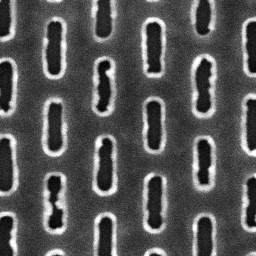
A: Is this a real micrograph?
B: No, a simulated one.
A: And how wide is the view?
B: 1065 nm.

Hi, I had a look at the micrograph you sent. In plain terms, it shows a regular array of holes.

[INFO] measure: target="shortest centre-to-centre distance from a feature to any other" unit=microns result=0.26